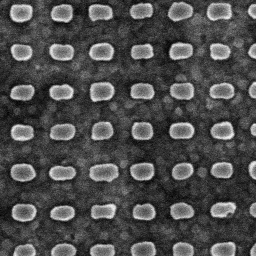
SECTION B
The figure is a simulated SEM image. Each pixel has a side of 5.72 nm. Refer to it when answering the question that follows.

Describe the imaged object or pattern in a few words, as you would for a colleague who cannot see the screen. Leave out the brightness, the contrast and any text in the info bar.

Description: a regular array of raised bodies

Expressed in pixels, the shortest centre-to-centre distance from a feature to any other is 38.9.